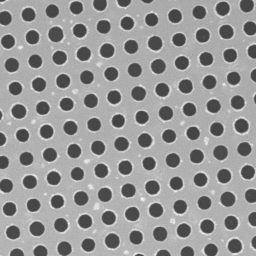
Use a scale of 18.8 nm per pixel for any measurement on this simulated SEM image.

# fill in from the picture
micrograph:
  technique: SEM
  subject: a regular array of holes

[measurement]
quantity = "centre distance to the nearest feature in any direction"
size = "0.442 microns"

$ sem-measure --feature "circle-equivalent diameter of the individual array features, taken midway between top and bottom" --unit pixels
14.1